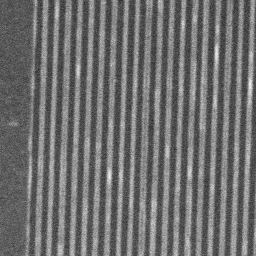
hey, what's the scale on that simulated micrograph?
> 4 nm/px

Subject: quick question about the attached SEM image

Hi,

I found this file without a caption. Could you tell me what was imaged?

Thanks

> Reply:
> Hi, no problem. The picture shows parallel lines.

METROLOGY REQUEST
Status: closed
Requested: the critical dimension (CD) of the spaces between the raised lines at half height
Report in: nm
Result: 27.5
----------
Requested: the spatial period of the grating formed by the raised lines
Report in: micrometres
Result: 0.0459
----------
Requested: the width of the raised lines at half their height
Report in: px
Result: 4.38